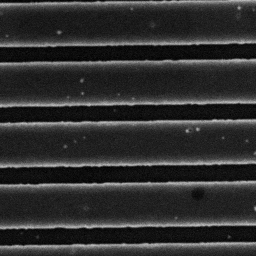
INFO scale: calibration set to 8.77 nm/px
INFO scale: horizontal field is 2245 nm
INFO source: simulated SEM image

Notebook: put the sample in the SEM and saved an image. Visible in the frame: lines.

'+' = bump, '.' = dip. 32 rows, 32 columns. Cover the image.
++++++++++++++++++++++++++++++++
++++++++++++++++++++++++++++++++
++++++++++++++++++++++++++++++++
++++++++++++++++++++++++++++++++
++++++++++++++++++++++++++++++++
++++++++++++++++++++++++........
................................
.............................+..
++++++++++++++++++++++++++++++++
++++++++++++++++++++++++++++++++
++++++++++++++++++++++++++++++++
++++++++++++++++++++++++++++++++
++++++++++++++++++++++++++++++++
................................
................................
++++++++++++++++++++++++++++++++
++++++++++++++++++++++++++++++++
++++++++++++++++++++++++++++++++
++++++++++++++++++++++++++++++++
++++++++++++++++++++++++++++++++
+++++++++++++++++++++++++++.....
................................
................................
++++++++++++++++++++++++++++++++
++++++++++++++++++++++++++++++++
++++++++++++++++++++++++++++++++
++++++++++++++++++++++++++++++++
++++++++++++++++++++++++++++++++
................................
................................
..................++++++++++++++
++++++++++++++++++++++++++++++++